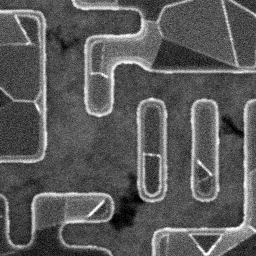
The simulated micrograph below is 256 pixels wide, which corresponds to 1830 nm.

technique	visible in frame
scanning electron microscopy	wiring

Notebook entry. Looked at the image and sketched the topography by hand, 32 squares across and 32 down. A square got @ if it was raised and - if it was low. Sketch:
----------@@@@@@@@@@@@@@@@@@@@@@
------------------@@@@@@@@@@@@@@
@@@@@-------------@@@@@@@@@@@@@@
@@@@@-------------@@@@@@@@@@@@@@
@@@@@------------@@@@@@@@@@@@@@@
@@@@@------@@@@@@@@@@@@@@@@@@@@@
@@@@@------@@@@@@@@@@@@@@@@@@@@@
@@@@@------@@@@@@@@@@@@@@@@@@@@@
@@@@@------@@@----@@@@@@@@@@@@@@
@@@@@------@@@------------------
@@@@@------@@@------------------
@@@@@------@@@------------------
@@@@@------@@@------------------
@@@@@------@@@----@@----@@@----@
@@@@@-------------@@----@@@----@
@@@@@-------------@@----@@@----@
@@@@@-------------@@----@@@----@
@@@@@-------------@@----@@@----@
@@@@@-------------@@----@@@----@
@@@@@-------------@@----@@@----@
------------------@@----@@@----@
------------------@@----@@@----@
------------------@@----@@@----@
------------------@@----@@@----@
-----@@@@@@@@-----@@-----@@----@
@---@@@@@@@@@@-----------------@
@---@@@@@@@@@@-----------------@
@---@@@@@@@@@------------------@
@---@@@@----------------------@@
@---@@@------------@@@@@@@@@@@@@
@---@@@@-----------@@@@@@@@@@@@@
@@@@@@@@@@@@@------@@@@@@@@@@@@@